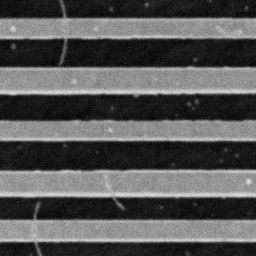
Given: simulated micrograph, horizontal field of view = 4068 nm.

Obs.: lines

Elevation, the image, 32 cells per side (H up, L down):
LLLLLLLLLLLLLLLLLLLLLLLLLLLLLLLL
LLLLLLLLLLLLLLLLLLLLLLLLLLLLLLLL
HHHHHHHHHHHHHHHHHHHHHHHHHHHHLLLL
HHHHHHHHHHHHHHHHHHHHHHHHHHHHHHHH
HHHHHHHHHHHHHHHHHHHHHHHHHHHHHHHH
LLLLLLLLLLLLLLLLLLLLLLLLLLLLLLLL
LLLLLLLLLLLLLLLLLLLLLLLLLLLLLLLL
LLLLLLLLLLLLLLLLLLLLLLLLLLLLLLLL
LLLLLLLLLLLLLLLLLLLLLLLLLLLLLLLL
HHHHHHHHHHHHHHHHHHHHHHHHHHHHHHHH
HHHHHHHHHHHHHHHHHHHHHHHHHHHHHHHH
HHHHHHHHHHLHLLLLLLLLLLLLLLLLLLLL
LLLLLLLLLLLLLLLLLLLLLLLLLLLLLLLL
LLLLLLLLLLLLLLLLLLLLLLLLLLLLLLLL
LLLLLLLLLLLLLLLLLLLLLLLLLLLLLLLL
HHHHHHHHHHHHHHHHHHHHHHHHHHHHHHHH
HHHHHHHHHHHHHHHHHHHHHHHHHHHHHHHH
LLLLLLLLLLLLLLLLLLLLLLLLLLLLLLLL
LLLLLLLLLLLLLLLLLLLLLLLLLLLLLLLL
LLLLLLLLLLLLLLLLLLLLLLLLLLLLLLLL
LLLLLLLLLLLLLLLLLLLLLLLLLLLLLLLL
HHHHHHHHHHHHHHHHHHHHHHHHHHHHHHHH
HHHHHHHHHHHHHHHHHHHHHHHHHHHHHHHH
HHHHHHHHHHHHHHHHHHHHHHHHHHHHHHHH
LLLLLLLLLLLLLLHLLLLLLLLLLLLLLLLL
LLLLLLLLLLLLLLLLLLLLLLLLLLLLLLLL
LLLLLLLLLLLLLLLLLLLLLLLLLLLLLLLL
LLLLHLLLLLLLLLLLLLLLLLLLLLLLLLLL
HHHHHHHHHHHHHHHHHHHHHHHHHHHHHHHH
HHHHHHHHHHHHHHHHHHHHHHHHHHHHHHHH
LLLLLLLLLLLLLLLLLLLLLLLLLLLLLLLL
LLLLLLLLLLLLLLLLLLLLLLLLLLLLLLLL